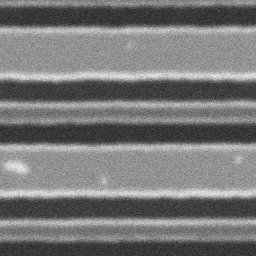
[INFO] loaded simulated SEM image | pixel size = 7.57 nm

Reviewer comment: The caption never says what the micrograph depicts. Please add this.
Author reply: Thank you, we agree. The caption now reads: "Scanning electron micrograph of lines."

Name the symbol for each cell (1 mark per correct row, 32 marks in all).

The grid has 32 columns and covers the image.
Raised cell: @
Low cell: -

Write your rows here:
@@@@@@@@@@@@@@@@@@@@@@@@@@@-@@@@
--------------------------------
--------------------------------
------------------@--@@-----@@-@
@@@@@@@@@@@@@@@@@@@@@@@@@@@@@@@@
@@@@@@@@@@@@@@@@@@@@@@@@@@@@@@@@
@@@@@@@@@@@@@@@@@@@@@@@@@@@@@@@@
@@@@@@@@@@@@@@@@@@@@@@@@@@@@@@@@
@@@@@@@@@@@@@@@@@@@@@@@@@@@@@@@@
@@@@@@@@@@@@@@@@@@@@@@@@@@@@@@@@
--------------------------------
--------------------------------
--------------------------------
@@@@@@@@@@@@@@@@@@@@@@@@@@@@@@@@
@@@@@@@@@@@@@@@@@@@@@@@@@@@@@@@@
--------------------------------
--------------------------------
--------------------------------
@@@@@@@@@@@@@@@@@@@@@@@@@@@@@@@@
@@@@@@@@@@@@@@@@@@@@@@@@@@@@@@@@
@@@@@@@@@@@@@@@@@@@@@@@@@@@@@@@@
@@@@@@@@@@@@@@@@@@@@@@@@@@@@@@@@
@@@@@@@@@@@@@@@@@@@@@@@@@@@@@@@@
@@@@@@@@@@@@@@@@@@@@@@@@@@@@@@@@
----------------------@---------
--------------------------------
--------------------------------
--------------------------------
@@@@@@@@@@@@@@@@@@@@@@@@@@@@@@@@
@@@@@@@@@@@@@@@@@@@@@@@@@@@@@@@@
--------------------------------
--------------------------------